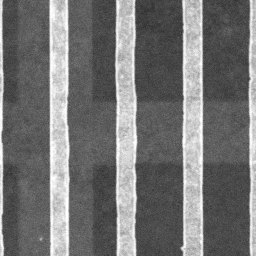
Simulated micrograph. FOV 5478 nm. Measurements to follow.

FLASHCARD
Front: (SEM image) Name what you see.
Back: one or a few lines or trenches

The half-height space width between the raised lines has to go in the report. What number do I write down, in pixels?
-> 49.8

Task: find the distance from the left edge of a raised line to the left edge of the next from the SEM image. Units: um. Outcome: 1.43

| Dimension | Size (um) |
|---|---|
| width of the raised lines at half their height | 0.361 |